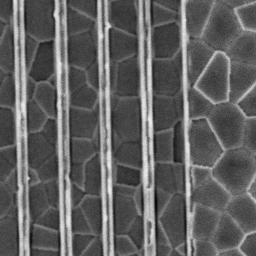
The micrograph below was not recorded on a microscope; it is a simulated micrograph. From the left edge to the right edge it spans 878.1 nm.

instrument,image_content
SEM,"parallel lines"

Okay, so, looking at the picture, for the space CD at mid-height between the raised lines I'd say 109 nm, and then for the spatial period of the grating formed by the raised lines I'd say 145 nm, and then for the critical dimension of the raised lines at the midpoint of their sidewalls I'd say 33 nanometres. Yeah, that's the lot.